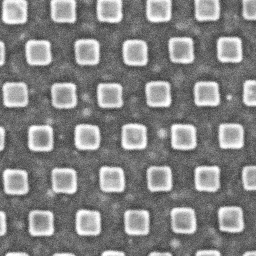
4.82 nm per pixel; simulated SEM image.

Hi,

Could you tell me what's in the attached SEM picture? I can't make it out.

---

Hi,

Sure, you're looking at a regular array of raised bodies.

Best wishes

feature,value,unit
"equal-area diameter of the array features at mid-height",121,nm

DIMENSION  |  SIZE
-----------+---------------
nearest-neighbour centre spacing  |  230 nanometres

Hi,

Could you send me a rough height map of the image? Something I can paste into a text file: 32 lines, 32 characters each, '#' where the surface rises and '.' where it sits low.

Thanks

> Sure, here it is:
##.....##...###...###....##...##
###....##...###...###....##...##
.##....##....##.....#...........
................................
................................
....##....##....##...###...###..
....##....##....##...###...###..
....##....##....##....##....##..
................................
................................
.##................##....##....#
.##....##...###...###...###....#
.##....##...###...###...###....#
................................
................................
................................
....##....##...###....##....##..
....##....##...###....##....##..
....##....##..........##........
................................
................................
.##....##....##....##....##....#
.##....##....##....##....##....#
.##....##....##....##....##....#
................................
................................
..........##....##....##....##..
#...##....##....##....##....##..
#...##....##....##....##....##..
................................
................................
.........................##.....